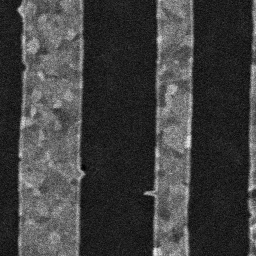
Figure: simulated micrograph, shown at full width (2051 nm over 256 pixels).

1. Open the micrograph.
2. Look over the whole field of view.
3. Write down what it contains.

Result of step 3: one or a few lines or trenches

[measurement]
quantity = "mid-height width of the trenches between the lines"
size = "565 nanometers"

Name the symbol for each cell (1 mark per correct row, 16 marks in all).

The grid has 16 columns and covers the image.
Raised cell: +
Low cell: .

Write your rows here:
.++++.....++....
.++++.....++....
..+++.....++....
..+++.....++....
..+++.....++....
..+++.....++....
..+++.....++....
.++++.....++....
.++++.....++....
.++++.....++....
.++++.....++....
.++++.....++....
.++++.....++....
.++++.....++....
.++++.....++....
.++++.....++....